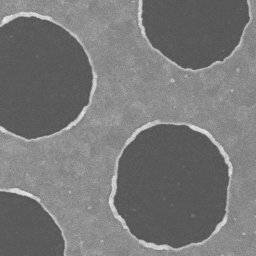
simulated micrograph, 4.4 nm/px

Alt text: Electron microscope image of holes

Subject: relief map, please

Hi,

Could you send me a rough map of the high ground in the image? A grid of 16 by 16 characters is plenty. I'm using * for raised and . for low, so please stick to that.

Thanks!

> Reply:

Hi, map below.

*********.......
....*****......*
.....****......*
.....*****....**
......**********
......**********
.....***********
.....***********
*..******....***
********......**
*******.......**
*******.......**
..*****.......**
...*****......**
....****.....***
....************